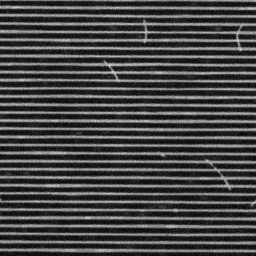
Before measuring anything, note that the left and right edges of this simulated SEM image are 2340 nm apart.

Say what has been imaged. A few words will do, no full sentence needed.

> parallel lines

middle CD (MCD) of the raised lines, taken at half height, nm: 19.4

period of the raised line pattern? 0.0739 micrometres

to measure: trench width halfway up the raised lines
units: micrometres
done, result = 0.0548